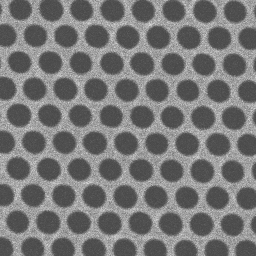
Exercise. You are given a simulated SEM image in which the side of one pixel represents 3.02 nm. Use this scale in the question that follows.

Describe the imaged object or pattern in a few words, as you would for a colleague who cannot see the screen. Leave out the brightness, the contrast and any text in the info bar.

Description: a regular array of holes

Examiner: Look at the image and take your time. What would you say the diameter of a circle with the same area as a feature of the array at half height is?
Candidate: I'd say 0.0709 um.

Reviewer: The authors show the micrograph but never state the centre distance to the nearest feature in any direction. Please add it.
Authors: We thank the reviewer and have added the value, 0.0919 micrometres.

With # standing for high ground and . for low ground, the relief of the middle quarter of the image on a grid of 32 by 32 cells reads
#......##......##......#......##
##.....###.....##.....###.....##
####.######..#####...#####...###
.######..#######################
..###.....###....####....####...
...##......##.....###.....##....
....#......##......#......##....
...##......##......##.....##....
...###....####....###.....###...
#######################.########
###...#####..#####..############
##.....##.....###.....###....###
#......##......##.....##......##
#......##......##......#......##
##.....##......##.....##......##
###...####....####....###....###
################################
..####....####...#####..#####...
...##.....###.....###.....##....
...##......##.....##......##....
...##......##......#......##....
..###.....###.....###.....##....
.######..#####...#####...####...
###.#######.####################
##....###.....###....####....###
#......##.....##......##......##
#......##......#......##......##
#......##.....##......##......##
##....####....###.....###....###
##########################..####
..####..######...#####..########
..###.....###.....##.....###....